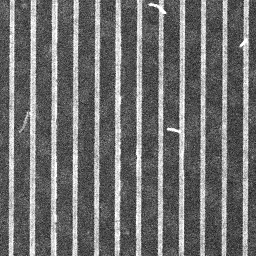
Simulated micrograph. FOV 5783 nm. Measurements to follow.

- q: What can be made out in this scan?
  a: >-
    parallel lines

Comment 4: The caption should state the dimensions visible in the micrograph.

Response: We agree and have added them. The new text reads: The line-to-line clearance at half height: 392 nm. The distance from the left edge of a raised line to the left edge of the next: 481 nanometres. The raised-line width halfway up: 93.2 nm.